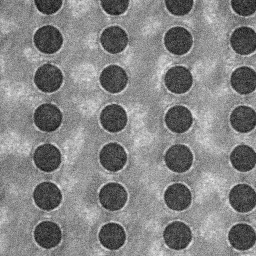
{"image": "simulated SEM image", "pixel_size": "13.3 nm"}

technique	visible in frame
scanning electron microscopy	a regular array of raised bodies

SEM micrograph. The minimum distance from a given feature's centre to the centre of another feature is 515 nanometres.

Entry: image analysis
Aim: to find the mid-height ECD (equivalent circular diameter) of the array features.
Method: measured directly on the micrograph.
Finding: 401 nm